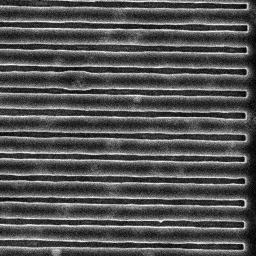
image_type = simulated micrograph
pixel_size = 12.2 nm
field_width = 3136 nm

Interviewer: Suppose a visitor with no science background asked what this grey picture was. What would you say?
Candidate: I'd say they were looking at parallel lines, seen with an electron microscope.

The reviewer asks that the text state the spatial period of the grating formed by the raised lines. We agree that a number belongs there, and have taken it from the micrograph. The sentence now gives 268 nm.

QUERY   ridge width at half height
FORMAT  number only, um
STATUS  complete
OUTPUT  0.19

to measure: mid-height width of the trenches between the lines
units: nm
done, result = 73.5